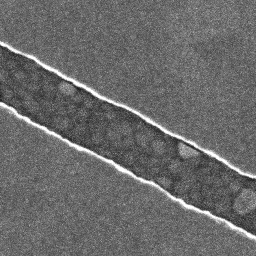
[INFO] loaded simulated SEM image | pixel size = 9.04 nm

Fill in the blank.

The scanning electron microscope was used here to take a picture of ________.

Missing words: one or a few lines or trenches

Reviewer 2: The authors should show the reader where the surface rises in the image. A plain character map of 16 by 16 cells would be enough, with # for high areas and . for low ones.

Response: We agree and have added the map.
################
################
################
..##############
...#############
.....###########
.......#########
##.......#######
####.......#####
######.......###
########.......#
##########......
###########.....
#############...
###############.
################